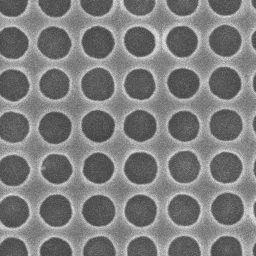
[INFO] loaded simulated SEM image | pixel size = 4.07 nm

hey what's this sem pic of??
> a regular array of holes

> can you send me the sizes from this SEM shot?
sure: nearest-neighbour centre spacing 169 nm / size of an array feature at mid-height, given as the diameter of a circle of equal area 136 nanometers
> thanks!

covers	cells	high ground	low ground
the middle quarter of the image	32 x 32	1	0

11111111111111111111111111111111
11111110000111111000011111100000
01111000000011110000001111000000
01110000000011100000000111000000
00110000000001100000000111000000
00110000000001100000000111000000
01110000000001100000000111000000
01111000000011110000001111100000
11111100000011111000011111110000
11111111111111111111111111111111
11111111111111111111111111111111
11111110011111111100111111111001
11111000000111110000001111100000
01111000000011100000000111000000
00110000000001100000000111000000
00110000000001100000000111000000
00110000000001100000000111000000
00111000000011100000000111000000
01111100000011110000001111100000
11111110001111111110111111111000
11111111111111111111111111111111
11111111111111111111111111111101
11111110001111111000001111100000
01111100000011110000000111100000
00111000000011100000000111000000
00111000000001100000000011000000
00111000000001100000000011000000
00111000000011100000000111000000
00111000000011110000000111100000
01111110000111110000001111110000
11111111111111111111111111111111
11111111111111111111111111111111